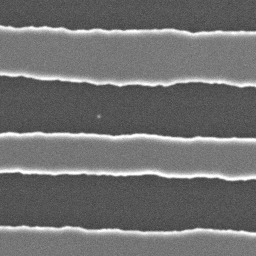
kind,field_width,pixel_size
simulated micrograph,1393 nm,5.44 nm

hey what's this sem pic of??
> lines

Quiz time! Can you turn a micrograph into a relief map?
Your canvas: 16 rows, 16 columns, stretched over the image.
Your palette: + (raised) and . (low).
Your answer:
................
................
++++++++++++++++
++++++++++++++++
++++++++++++++++
................
................
................
+++++++.++......
++++++++++++++++
++++++++++++++++
................
................
................
+++++++++.+++++.
++++++++++++++++